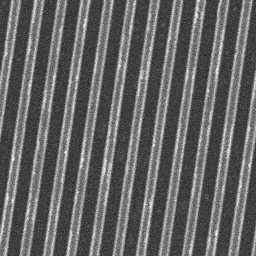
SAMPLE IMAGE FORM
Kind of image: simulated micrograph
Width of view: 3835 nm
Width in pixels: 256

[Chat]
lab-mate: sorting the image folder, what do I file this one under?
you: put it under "parallel lines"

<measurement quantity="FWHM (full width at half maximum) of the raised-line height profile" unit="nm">139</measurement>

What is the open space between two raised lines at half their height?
207 nm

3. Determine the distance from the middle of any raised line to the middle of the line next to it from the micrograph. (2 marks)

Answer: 343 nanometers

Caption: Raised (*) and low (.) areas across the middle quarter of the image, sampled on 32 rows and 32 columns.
..**....**....**...**....**....*
..**....**...**....**....**....*
..**...***...**....**....**....*
.***...**....**....**....**...**
.**....**....**....**...***...**
.**....**....**....**...***...**
.**....**....**....*....**....**
.**....**....*....**....**....**
.**....**...**....**....**....**
.**...***...**....**....**....**
***...**....**....**....**...***
**....**....**....**...***...**.
**....**....**....**...**....**.
**....**....**...**....**....**.
**....**...**....**....**....**.
**...***...**....**....**....**.
**...***...**....**....**....**.
**...**....**....**....**...***.
*....**....**....**...***...**..
*....**....**....**...**....**..
*....**....**...**....**....**..
*....**...**....**....**....**..
*...**....**....**....**....**..
*...**....**....**....**....**..
....**....**....**...***...***..
....**....**...***...***...**...
....**....**....**...**....**...
....**....**...**....**....**...
....**...**....**....**....**...
...**....**....**....**....**...
...**....**....**....**...***...
...**....**....**...***...***...